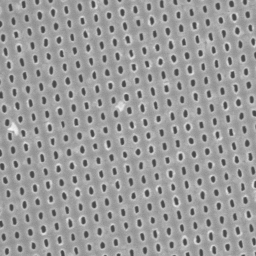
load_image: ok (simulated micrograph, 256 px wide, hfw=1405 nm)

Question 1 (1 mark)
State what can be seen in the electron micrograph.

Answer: a regular array of holes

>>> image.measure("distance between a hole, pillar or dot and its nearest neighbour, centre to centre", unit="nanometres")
73.6